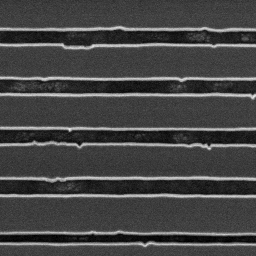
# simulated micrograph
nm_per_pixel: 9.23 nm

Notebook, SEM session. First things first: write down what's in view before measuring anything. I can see parallel lines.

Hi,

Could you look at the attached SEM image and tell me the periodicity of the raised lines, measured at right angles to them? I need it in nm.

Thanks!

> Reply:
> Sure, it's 470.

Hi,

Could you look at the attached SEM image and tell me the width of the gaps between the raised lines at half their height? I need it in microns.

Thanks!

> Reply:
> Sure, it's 0.139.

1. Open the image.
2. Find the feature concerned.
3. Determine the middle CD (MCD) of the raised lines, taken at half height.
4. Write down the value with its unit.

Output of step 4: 35 pixels